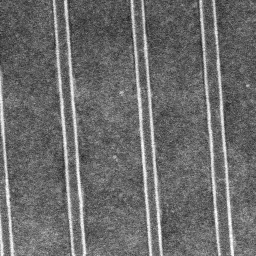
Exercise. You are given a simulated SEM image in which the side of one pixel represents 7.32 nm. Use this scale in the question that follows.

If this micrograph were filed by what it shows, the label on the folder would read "one or a few lines or trenches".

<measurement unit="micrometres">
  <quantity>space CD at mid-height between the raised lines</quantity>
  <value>0.44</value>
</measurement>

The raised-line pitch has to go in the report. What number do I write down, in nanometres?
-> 537